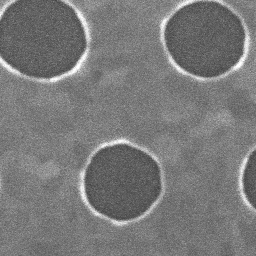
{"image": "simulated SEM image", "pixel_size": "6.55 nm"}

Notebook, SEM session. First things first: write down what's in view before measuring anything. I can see holes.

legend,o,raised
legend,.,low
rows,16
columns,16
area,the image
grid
.....oooooo...oo
.....ooooo.....o
.....ooooo.....o
.....oooooo....o
o...oooooooo..oo
oooooooooooooooo
oooooooooooooooo
oooooooooooooooo
oooooooooooooooo
oooooo...ooooooo
ooooo.....ooooo.
ooooo.....ooooo.
ooooo.....ooooo.
ooooooo..ooooooo
oooooooooooooooo
oooooooooooooooo